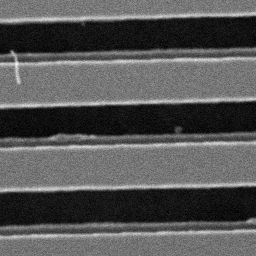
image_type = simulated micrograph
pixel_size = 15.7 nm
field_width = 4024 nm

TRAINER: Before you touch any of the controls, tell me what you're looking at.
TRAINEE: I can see lines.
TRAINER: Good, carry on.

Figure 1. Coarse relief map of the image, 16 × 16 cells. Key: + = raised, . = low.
++++++++++++++++
................
................
++++++++++++++++
++++++++++++++++
++++++++++++++++
+++++++.........
................
...+++.....+++++
++++++++++++++++
++++++++++++++++
++++++++++++++++
................
................
++++++++++++++++
++++++++++++++++